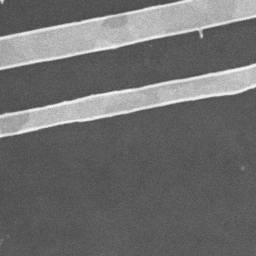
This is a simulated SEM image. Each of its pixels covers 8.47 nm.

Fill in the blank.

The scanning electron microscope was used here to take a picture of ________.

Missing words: one or a few lines or trenches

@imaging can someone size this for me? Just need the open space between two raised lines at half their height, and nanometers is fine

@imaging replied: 398